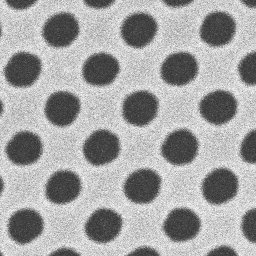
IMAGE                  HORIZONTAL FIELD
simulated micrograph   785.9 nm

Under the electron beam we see a regular array of holes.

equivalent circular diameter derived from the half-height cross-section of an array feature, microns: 0.115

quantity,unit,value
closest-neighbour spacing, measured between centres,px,54.9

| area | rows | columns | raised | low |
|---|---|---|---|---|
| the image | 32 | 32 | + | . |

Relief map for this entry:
+...+++++++...+++++++...++++++..
+++++++++++++++++.++++++++..++++
++++++....+++++.....+++++....+++
+++++.....+++++.....+++++.....++
+++++.....+++++....++++++....+++
++++++...+++++++...+++++++..++++
++..++++++++++++++++++.++++++++.
+....++++++....+++++.....+++++..
.....+++++.....+++++.....+++++..
.....+++++.....+++++.....+++++..
+...+++++++...+++++++...+++++++.
+++++++..++++++++..+++++++...+++
++++++....+++++.....+++++.....++
++++++....+++++.....+++++.....++
++++++....+++++.....+++++....+++
++++++...+++++++...+++++++..++++
++..++++++++..+++++++...+++++++.
+....++++++....+++++.....+++++..
+....+++++.....+++++.....+++++..
+....+++++.....+++++.....+++++..
++..+++++++...+++++++...+++++++.
+++++++..++++++++...++++++...+++
++++++....++++++....+++++.....++
.+++++....+++++.....+++++.....++
++++++....++++++....+++++....+++
+++++++.+++++++++..+++++++..++++
++...+++++++...++++++...+++++++.
+....++++++....++++++....+++++..
+....+++++.....+++++.....+++++..
+....++++++....++++++....+++++..
++..++++++++++++++++++++++++++++
++++++....++++++....++++++....++